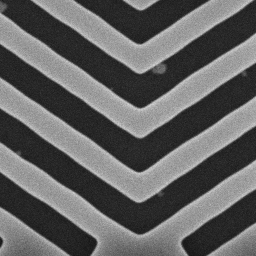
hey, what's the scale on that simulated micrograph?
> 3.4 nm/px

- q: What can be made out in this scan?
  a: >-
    groups of lines, slits or small figures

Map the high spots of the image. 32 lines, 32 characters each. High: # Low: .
.....#####......###.......#####.
......#####.............######..
#......######.........######....
###......#####.......#####......
####......######...######.......
######......###########.......##
.######......#########......####
...#####.......######......#####
....######......###......######.
......#####.............#####...
#......######.........######....
###......#####.......#####......
####......######....#####......#
#####.......#####.#####.......##
..#####......#########......####
...#####......#######......#####
....######......###......######.
......#####.............#####...
#......######.........######....
##.......#####.......#####......
####......#####....######......#
######.....######.#####.......##
.######......#########......####
...#####......######.......#####
....######......###......######.
......#####.............#####...
#......#####..........######....
##.......#####.......#####......
####......######...######......#
#####.......###########.......##
#######.....###########.....####
########....###########....#####